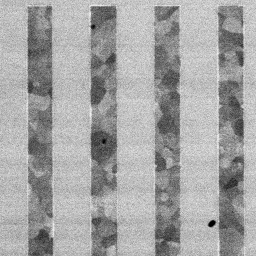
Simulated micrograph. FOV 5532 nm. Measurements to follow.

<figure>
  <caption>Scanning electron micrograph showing one or a few lines or trenches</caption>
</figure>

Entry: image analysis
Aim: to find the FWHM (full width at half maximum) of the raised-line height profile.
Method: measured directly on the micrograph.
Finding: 26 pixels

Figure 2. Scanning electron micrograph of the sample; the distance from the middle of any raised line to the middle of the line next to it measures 1380 nanometers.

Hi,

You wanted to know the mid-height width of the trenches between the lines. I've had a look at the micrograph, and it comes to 808 nm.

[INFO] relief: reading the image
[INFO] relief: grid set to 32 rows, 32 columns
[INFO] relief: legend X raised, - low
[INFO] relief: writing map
--------------------------------
---XXXX----XXXX----XXX-----XXX--
---XX------XXXX----XXX-----XXX--
---XXX-----XXXX----XXX-----XXX--
---XXX-----XXXX----XXX-----XXX--
---XXX-----XXXX----XXX-----XXX--
---XXXX----XXXX----XXX-----XXX--
---XXXX----XXXX----XXXX----XXX--
---X-XX----XXXX----XXXX----XXX--
---X-------XXXX----XXX-----XXX--
---XXXX----XXXX----XXX-----XXX--
---XXXX----XXXX----XXX-----XXX--
---XXXX----XXXX----XXX-----XXX--
---XXXX----XXXX----XXX-----XXX--
---XXXX----XXXX----XXX-----XXX--
---XXXX----XXXX----XXXX----XXX--
---XXXX----XXXX----XXXX----XXX--
---XXXX----XXXX----XXXX----XXX--
---XXXX----XXXX----XXXX----XXX--
---XXXX----XXXX----XXXX----XXXX-
---XXXX----XXXX----XXXX----XXX--
---XXXX----XXXX----XXXX----XXX--
---XXX-----XXXX----XXXX----XXX--
---XXX-----XXXX----XXXX----XXX--
---XXXX------XX----XXXX----XXX--
---XXXX------XX----XXXX----XXX--
---XXXX----X--X----XXXX----XXX--
----XXX----XXXX----XXXX----XXX--
----XXX----XXXX----XXXX----XXX--
----XXX----XXXX----XXXX----XXX--
----XXX----XXXX----XXXX----XXXX-
----XXX----XXXX----XXXX----XXXX-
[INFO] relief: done